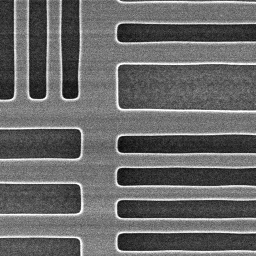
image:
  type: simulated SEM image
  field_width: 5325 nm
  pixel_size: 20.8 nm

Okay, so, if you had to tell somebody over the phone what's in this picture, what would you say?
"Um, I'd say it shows groups of lines, slits or small figures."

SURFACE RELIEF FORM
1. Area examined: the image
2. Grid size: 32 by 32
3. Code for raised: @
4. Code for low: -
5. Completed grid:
--@@--@@--@@@@@@@@@@@@@@@@@@@@@@
--@@--@@--@@@@@@@@@@@@@@@@@@@@@@
--@@--@@--@@@@@@@@@@@@@@@@@@@@@@
--@---@@--@@@@@-----------------
--@---@@--@@@@@-----------------
--@@--@@--@@@@@@@@@@@@@@@@@@@@@@
--@@--@@--@@@@@@@@@@@@@@@@@@@@@@
--@@--@@--@@@@@@@@@@@@@@@@@@@@@@
--@@--@@--@@@@@-----------------
--@@--@@--@@@@@-----------------
--@@--@@--@@@@@-----------------
--@@--@@--@@@@@-----------------
-@@@@@@@@@@@@@@-----------------
@@@@@@@@@@@@@@@-----------------
@@@@@@@@@@@@@@@@@@@@@@@@@@@@@@@@
@@@@@@@@@@@@@@@@@@@@@@@@@@@@@@@@
----------@@@@@@@@@@@@@@@@@@@@@@
----------@@@@@-----------------
----------@@@@@-----------------
----------@@@@@@@@@@@@@@@@@@@@@@
@@@@@@@@@@@@@@@@@@@@@@@@@@@@@@@@
@@@@@@@@@@@@@@@-----------------
@@@@@@@@@@@@@@@-----------------
----------@@@@@@@@@@@@@@@@@@@@@@
----------@@@@@@@@@@@@@@@@@@@@@@
----------@@@@@-----------------
----------@@@@@-----------------
@@@@@@@@@@@@@@@@@@@@@@@@@@@@@@@@
@@@@@@@@@@@@@@@@@@@@@@@@@@@@@@@@
@@@@@@@@@@@@@@@-----------------
----------@@@@@-----------------
----------@@@@@@@@@@@@@@@@@@@@@@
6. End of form